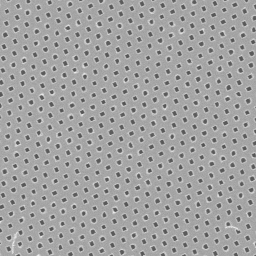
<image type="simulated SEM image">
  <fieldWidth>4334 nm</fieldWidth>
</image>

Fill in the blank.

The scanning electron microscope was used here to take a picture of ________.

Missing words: a regular array of holes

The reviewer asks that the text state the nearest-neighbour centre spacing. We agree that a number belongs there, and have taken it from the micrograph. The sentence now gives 193 nm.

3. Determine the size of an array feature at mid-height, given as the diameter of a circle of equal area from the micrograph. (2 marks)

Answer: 78.8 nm